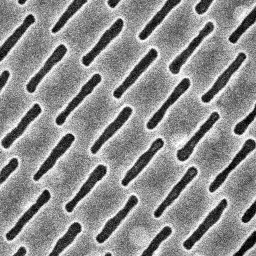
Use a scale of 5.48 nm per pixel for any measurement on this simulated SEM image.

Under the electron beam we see a regular array of holes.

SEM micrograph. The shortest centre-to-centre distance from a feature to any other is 244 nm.